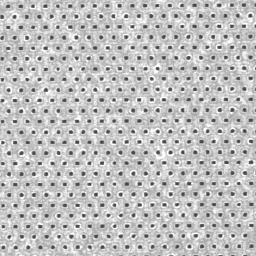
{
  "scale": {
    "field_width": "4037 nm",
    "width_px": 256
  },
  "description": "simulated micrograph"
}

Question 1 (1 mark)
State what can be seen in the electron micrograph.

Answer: a regular array of holes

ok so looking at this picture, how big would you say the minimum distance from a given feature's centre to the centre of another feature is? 0.188 micrometres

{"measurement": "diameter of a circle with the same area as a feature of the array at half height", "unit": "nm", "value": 68.9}